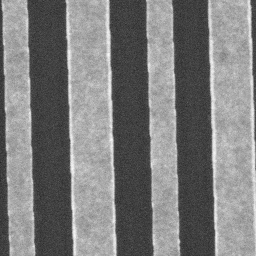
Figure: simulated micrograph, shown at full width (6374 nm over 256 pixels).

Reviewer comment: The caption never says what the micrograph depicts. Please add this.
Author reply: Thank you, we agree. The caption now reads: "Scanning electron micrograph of lines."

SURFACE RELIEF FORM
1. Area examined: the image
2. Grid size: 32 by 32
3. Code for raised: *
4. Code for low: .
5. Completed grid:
***.....*****.....****....*****.
***.....*****.....****....*****.
***.....*****.....****....*****.
***.....******....****....*****.
***......*****....****....*****.
***......*****.....***....*****.
.***.....*****.....***....*****.
.***.....*****.....***....*****.
.***.....*****.....***....*****.
.***.....*****.....***....*****.
.***.....*****.....***....******
.***.....*****.....***....******
.***.....*****.....***....******
.***.....*****.....***....******
.***.....*****.....***.....*****
.***.....*****.....***.....*****
.***.....*****.....***.....*****
.***.....*****.....***.....*****
.***.....*****.....***.....*****
.***.....*****.....***.....*****
.***.....*****.....***.....*****
.***.....*****.....***.....*****
.***.....*****.....***.....*****
.***.....*****.....***.....*****
.***.....*****.....***.....*****
.***.....*****.....***.....*****
.***.....*****.....***.....*****
.***.....*****.....***.....*****
.***.....*****.....***.....*****
.***.....*****.....***.....*****
.***.....*****.....***.....*****
.***.....*****.....***.....*****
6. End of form